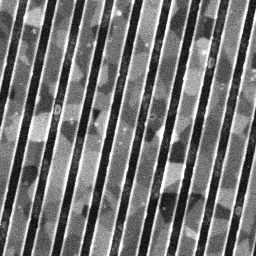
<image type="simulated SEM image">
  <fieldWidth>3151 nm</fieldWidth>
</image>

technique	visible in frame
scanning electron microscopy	parallel lines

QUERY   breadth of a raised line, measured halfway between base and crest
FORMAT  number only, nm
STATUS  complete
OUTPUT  232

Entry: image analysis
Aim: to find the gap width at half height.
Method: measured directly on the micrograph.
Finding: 0.116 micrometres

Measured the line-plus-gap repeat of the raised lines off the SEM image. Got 346 nm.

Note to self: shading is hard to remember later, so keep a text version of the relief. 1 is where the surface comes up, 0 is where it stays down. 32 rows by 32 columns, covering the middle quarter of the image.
00111110011111001111100011110001
00111110011111001111100111110001
00111100011111001111100111110011
01111100011110001111100111110011
01111100111110001111000111100011
01111100111110011111000111100011
01111000111110011111001111100011
11111000111100011111001111100111
11111001111100011110001111100111
11111001111100011110001111000111
11111001111100111110011111000111
11110001111100111110011111001111
11110001111000111110011111001111
11110011111000111100011111001111
11110011111001111100111110001111
11110011111001111100111110001111
11100011111001111100111110001111
11100011110001111100111110011111
11100111110001111000111100011111
11100111110011111000111100011110
11000111110011111001111100011110
11000111100011111001111100111110
11000111100011110001111100111110
11001111100111110001111000111110
11001111100111110001111000111100
10001111100111110011111000111100
10001111000111110011111001111100
10011111000111100011111001111100
10011111001111100011110001111100
10011111001111100111110001111000
00011111001111100111110001111000
00011110001111100111110010111001